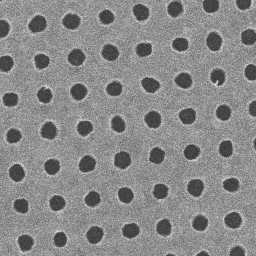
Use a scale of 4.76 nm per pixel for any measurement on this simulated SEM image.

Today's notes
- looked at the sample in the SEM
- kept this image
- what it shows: a regular array of holes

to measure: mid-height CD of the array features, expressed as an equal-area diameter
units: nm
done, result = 78.4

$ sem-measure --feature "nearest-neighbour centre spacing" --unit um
0.163